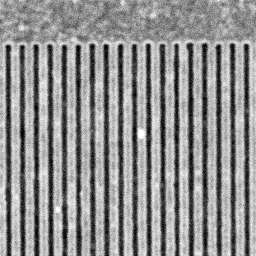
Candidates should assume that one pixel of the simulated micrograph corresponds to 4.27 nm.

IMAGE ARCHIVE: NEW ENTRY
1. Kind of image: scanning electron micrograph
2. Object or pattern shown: parallel lines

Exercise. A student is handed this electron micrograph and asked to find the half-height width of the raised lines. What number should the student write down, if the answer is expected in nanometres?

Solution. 32.6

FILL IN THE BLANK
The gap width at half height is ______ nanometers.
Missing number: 25.6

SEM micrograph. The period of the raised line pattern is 14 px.